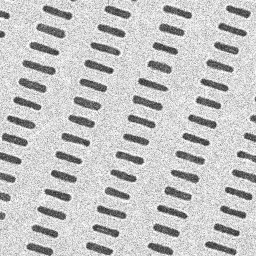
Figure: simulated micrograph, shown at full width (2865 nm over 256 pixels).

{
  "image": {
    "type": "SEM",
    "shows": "a regular array of holes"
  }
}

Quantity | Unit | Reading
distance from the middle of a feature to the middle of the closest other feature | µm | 0.213